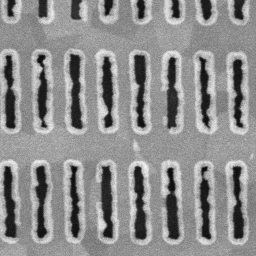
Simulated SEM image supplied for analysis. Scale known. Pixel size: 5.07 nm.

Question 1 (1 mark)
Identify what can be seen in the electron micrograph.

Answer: a regular array of holes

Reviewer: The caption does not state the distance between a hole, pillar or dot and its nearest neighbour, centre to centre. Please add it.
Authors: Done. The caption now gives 165 nanometers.